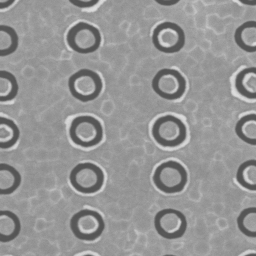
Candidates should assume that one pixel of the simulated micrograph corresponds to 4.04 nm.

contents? a regular array of ring-shaped grooves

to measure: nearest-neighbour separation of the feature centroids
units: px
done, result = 46.6